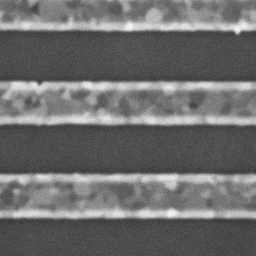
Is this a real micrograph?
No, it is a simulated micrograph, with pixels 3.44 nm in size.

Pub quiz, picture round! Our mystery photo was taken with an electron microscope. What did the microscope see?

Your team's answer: one or a few lines or trenches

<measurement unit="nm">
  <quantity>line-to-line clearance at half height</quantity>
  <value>202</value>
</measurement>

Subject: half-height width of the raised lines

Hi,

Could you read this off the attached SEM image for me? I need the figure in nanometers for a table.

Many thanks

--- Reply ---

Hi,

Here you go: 121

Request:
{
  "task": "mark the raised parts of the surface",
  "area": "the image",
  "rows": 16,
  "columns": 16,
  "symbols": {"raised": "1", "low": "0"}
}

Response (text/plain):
1111111111111111
1111111111111111
0000000000000000
0000000000000000
0000000000000000
1111111111111111
1111111111111111
1111001111111111
0000000000000000
0000000000000000
0000000000000000
1111111111111111
1111111111111111
0000000000000000
0000000000000000
0000000000000000